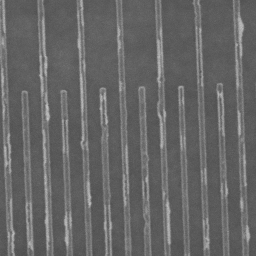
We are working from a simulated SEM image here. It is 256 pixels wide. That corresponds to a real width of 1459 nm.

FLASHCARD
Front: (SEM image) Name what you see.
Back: parallel lines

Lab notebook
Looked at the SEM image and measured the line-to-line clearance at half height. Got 77.5 nm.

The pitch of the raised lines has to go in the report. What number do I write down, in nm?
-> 111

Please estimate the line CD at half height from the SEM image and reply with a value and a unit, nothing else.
33.4 nanometres